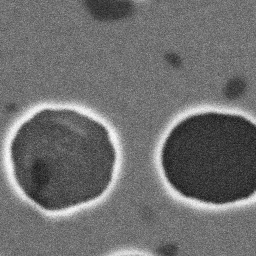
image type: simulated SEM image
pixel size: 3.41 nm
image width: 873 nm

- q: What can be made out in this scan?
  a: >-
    holes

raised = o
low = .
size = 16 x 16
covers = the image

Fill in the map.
oooooooooooooooo
oooooooooooooooo
oooooooooooooooo
oooooooooooooooo
oooooooooooooooo
oooooooooooooooo
oooooooooooooooo
oo....ooooo.....
o......ooo......
o......ooo......
o......ooo......
o......oooo.....
oo....oooooo...o
oooooooooooooooo
oooooooooooooooo
oooooooooooooooo